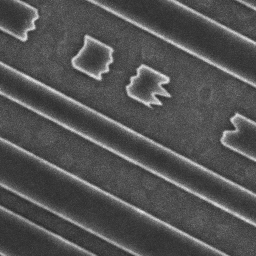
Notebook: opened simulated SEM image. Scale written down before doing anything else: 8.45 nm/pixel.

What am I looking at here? one or a few lines or trenches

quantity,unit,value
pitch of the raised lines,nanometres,576